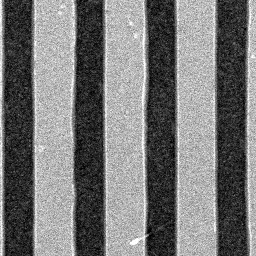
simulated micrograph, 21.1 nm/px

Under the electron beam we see one or a few lines or trenches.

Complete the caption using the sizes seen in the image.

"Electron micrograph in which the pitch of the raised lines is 1.5 um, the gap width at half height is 672 nm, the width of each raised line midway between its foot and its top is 39.4 pixels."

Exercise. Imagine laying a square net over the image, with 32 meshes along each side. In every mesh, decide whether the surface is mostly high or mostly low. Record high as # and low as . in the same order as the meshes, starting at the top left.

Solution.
....#####....#####....#####....#
....#####....#####....#####....#
....#####....#####....#####....#
....#####....#####....#####....#
....#####....#####....#####....#
....#####....#####....#####....#
....#####....#####....#####....#
....#####....#####....#####....#
....#####....#####....#####....#
....#####....#####....#####....#
....#####....#####....#####....#
....#####....#####....#####....#
....#####....#####....#####....#
....#####....#####....#####....#
....#####....#####....#####....#
....#####....#####....#####....#
....#####....#####....#####....#
....#####....#####....#####....#
....#####....#####....#####....#
....#####....#####....#####....#
....#####....#####....#####....#
....#####....#####....#####....#
....#####....#####....#####....#
....#####....#####....#####....#
....#####....#####....#####....#
....#####....#####....#####....#
....#####....#####....#####....#
....#####....#####....#####....#
....#####....#####....#####....#
....#####....#####....#####....#
....#####....#####....#####....#
....#####....#####....#####....#